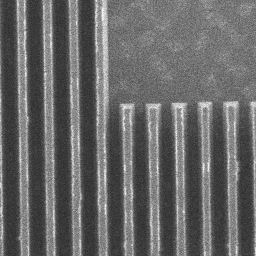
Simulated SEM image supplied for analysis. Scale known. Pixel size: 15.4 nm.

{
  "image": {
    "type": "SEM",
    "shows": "parallel lines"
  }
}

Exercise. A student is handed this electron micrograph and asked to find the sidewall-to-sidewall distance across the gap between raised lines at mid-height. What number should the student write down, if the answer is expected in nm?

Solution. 237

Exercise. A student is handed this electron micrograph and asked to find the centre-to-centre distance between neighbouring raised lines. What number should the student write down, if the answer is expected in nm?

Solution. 401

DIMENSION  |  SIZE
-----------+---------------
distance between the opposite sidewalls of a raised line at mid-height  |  10.6 pixels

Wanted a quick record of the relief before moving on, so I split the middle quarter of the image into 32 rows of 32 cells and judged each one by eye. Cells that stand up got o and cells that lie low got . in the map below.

.ooo....oo......................
.ooo....oo......................
.ooo....oo......................
.ooo....oo......................
.ooo....oo......................
.ooo....oo......................
.ooo....oo......................
..oo....oo......................
.ooo....oo......................
..oo....oo......................
..oo....oo.................ooo..
..oo....oo.....oo....ooo...ooo..
.ooo....oo.....oo....ooo....oo..
.ooo....oo....ooo....ooo....oo..
..oo....ooo...ooo....ooo....oo..
.ooo....ooo....oo....ooo....oo..
.ooo....ooo....oo....ooo....oo..
..oo....ooo....oo....ooo....oo..
.ooo....ooo....oo....ooo....oo..
.ooo....ooo....oo....ooo....oo..
..oo....ooo....oo....ooo....oo..
..oo....ooo...ooo....ooo....oo..
..oo....ooo...ooo....ooo....oo..
..oo....ooo....oo....ooo....oo..
..oo....ooo....oo....ooo....oo..
..oo....ooo....oo....ooo....oo..
..oo....ooo....oo....ooo....oo..
..oo....ooo....oo....ooo....oo..
..oo....ooo....oo....ooo....oo..
..oo....ooo....oo....ooo....oo..
..oo....ooo....oo....ooo....oo..
..oo....ooo....oo....ooo....oo..